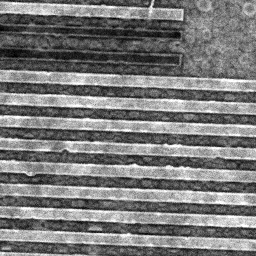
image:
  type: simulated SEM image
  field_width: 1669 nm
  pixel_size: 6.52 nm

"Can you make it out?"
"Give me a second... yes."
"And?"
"parallel lines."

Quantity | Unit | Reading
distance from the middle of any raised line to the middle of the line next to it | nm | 148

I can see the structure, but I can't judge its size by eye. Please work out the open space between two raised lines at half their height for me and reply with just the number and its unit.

80.7 nm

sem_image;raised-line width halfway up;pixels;10.5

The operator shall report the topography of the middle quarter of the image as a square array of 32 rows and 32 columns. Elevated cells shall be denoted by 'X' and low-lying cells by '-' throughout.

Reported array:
--------------------------------
--------------------------------
XXXX----------------------------
XXXXXXXXXXXXXXXXXXXXXXXXXXXX----
XXXXXXXXXXXXXXXXXXXXXXXXXXXXXXXX
------------------XXXXXXXXXXXXXX
--------------------------------
--------------------------------
XXXXXXXXXX----------------------
XXXXXXXXXXXXXXXXXXXXXXXXXXXXXXXX
XXXXXXXXXXXXXXXXXXXXXXXXXXXXXXXX
-------------------------XXXXXXX
--------------------------------
--------------------------------
XXXXXXXXXXXXXXXXXXXXXXX---------
XXXXXXXXXXXXXXXXXXXXXXXXXXXXXXXX
-------------XXXXXXXXXXXXXXXXXXX
--------------------------------
--------------------------------
XXXXX---------------------------
XXXXXXXXXXXXXXXXXXXXXXXXXXXXXX--
-XXXXXXXXXXXXXXXXXXXXXXXXXXXXXXX
-------------------XXXXXXXXXXXXX
--------------------------------
--------------------------------
XXXXXXXXXXX-XXXXXXX-------X-----
XXXXXXXXXXXXXXXXXXXXXXXXXXXXXXXX
-XXXXXXXXXXXXXXXXXXXXXXXXXXXXXXX
-------------------------XXXXXXX
--------------------------------
--------------------------------
XXXXXXXXXXXXXXXXXXX-XXX---------